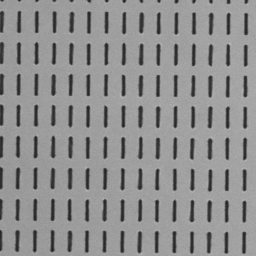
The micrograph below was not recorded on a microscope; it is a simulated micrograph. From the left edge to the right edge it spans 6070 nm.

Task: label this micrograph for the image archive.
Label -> a regular array of holes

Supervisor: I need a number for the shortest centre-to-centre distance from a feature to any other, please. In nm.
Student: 410